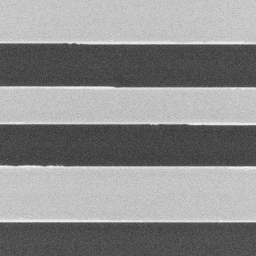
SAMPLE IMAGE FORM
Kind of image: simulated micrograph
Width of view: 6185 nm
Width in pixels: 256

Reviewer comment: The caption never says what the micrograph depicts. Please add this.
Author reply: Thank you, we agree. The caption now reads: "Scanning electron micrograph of lines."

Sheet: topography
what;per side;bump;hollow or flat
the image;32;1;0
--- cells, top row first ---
11111111111111111111111111111111
11111111111111111111111111111111
11111111111111111111111111111111
11111111111111111111111111111111
11111111111111111111111111111111
00000000000000000000000000000000
00000000000000000000000000000000
00000000000000000000000000000000
00000000000000000000000000000000
00000000000000000000000000000000
00000000000000000000000000000000
11111111111111111111111111111111
11111111111111111111111111111111
11111111111111111111111111111111
11111111111111111111111111111111
00000000000000000001000111111111
00000000000000000000000000000000
00000000000000000000000000000000
00000000000000000000000000000000
00000000000000000000000000000000
00000000000000000000000000000000
11111111111111111111111111111111
11111111111111111111111111111111
11111111111111111111111111111111
11111111111111111111111111111111
11111111111111111111111111111111
11111111111111111111111111111111
11111111111111111111111111111111
00000000000000000000000000000000
00000000000000000000000000000000
00000000000000000000000000000000
00000000000000000000000000000000